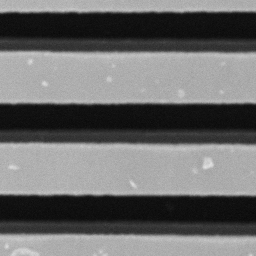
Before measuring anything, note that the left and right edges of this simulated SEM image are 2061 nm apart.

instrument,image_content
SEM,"lines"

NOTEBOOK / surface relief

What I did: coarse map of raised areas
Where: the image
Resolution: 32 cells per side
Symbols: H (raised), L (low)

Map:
HHHHHHHHHHHHHHHHHHHHHHHHHHHHHHHH
HHHHHHHHHHHHHHHHHHHHHHHHLLHHHLLH
LLLLLLLLLLLLLLLLLLLLLLLLLLLLLLLL
LLLLLLLLLLLLLLLLLLLLLLLLLLLLLLLL
LLLLLLLLLLLLLLLLLLLLLLLLLLLLLLLL
LLLLLLLLLLLLLLLLLLLLLLLLLLLLLLLL
HHHHHHHHLLLHHLHLLLLLLLLLLLLLLLLL
HHHHHHHHHHHHHHHHHHHHHHHHHHHHHHHH
HHHHHHHHHHHHHHHHHHHHHHHHHHHHHHHH
HHHHHHHHHHHHHHHHHHHHHHHHHHHHHHHH
HHHHHHHHHHHHHHHHHHHHHHHHHHHHHHHH
HHHHHHHHHHHHHHHHHHHHHHHHHHHHHHHH
HHHHHHHHHHHHHHHHHHHHHHHHHHHHHHHH
LLLLLLLLLLLLLLLLLLLLLLLLLLLLLLLL
LLLLLLLLLLLLLLLLLLLLLLLLLLLLLLLL
LLLLLLLLLLLLLLLLLLLLLLLLLLLLLLLL
LLLLLLLLLLLLLLLLLLLLLLLLLLLLLLLL
LLLLLLLLLLLLLLLLLLLLLLLLLLLLLLLL
HHHHHHHHHHHHHHHHHHHHHHHHHHHHHHHH
HHHHHHHHHHHHHHHHHHHHHHHHHHHHHHHH
HHHHHHHHHHHHHHHHHHHHHHHHHHHHHHHH
HHHHHHHHHHHHHHHHHHHHHHHHHHHHHHHH
HHHHHHHHHHHHHHHHHHHHHHHHHHHHHHHH
HHHHHHHHHHHHHHHHHHHHHHHHHHHHHHHH
LLLLLLLLLLLLLLLLLLLLLLLLLLLLLLLL
LLLLLLLLLLLLLLLLLLLLLLLLLLLLLLLL
LLLLLLLLLLLLLLLLLLLLLLLLLLLLLLLL
LLLLLLLLLLLLLLLLLLLLLLLLLLLLLLLL
LLLLLLLLLLLLLLLLLLLLLLLLLLLLLLLL
HHHHHHHHHHHHHHHHHHHHHHHHHHHHLLLL
HHHHHHHHHHHHHHHHHHHHHHHHHHHHHHHH
HHHHHHHHHHHHHHHHHHHHHHHHHHHHHHHH